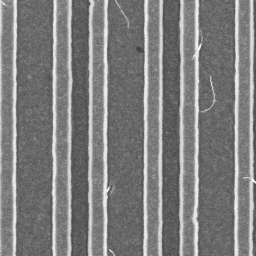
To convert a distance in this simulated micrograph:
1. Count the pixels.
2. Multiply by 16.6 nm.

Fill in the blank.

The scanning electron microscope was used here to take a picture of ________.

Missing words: parallel lines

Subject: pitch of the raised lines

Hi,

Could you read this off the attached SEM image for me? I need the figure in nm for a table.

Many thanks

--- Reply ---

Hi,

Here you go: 757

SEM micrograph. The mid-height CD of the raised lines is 266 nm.